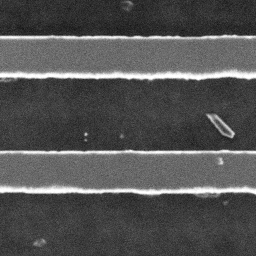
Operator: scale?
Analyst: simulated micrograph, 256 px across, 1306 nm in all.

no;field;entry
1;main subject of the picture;lines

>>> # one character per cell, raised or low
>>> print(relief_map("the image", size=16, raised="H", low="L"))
LLLLLLLLLLLLLLLL
LLLLLLLLLLLLLLLL
HHHHHHHHHHHHHHHH
HHHHHHHHHHHHHHHH
HHHHHHHHHHHHHHHH
LLLLLLLLLLLLLLLL
LLLLLLLLLLLLLLLL
LLLLLLLLLLLLLLLL
LLLLLLLLLLLLLLLL
HHHHHHHHHHHHHHHH
HHHHHHHHHHHHHHHH
HHHHHHHHHHHHHHHH
LLLLLLLLLLLLLLLL
LLLLLLLLLLLLLLLL
LLLLLLLLLLLLLLLL
LLLLLLLLLLLLLLLL